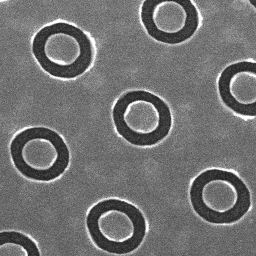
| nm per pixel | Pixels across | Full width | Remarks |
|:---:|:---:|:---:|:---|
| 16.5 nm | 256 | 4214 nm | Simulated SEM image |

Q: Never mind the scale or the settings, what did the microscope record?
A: ring-shaped grooves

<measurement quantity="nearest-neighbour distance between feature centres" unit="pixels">105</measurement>